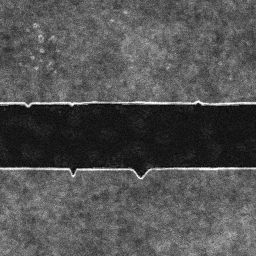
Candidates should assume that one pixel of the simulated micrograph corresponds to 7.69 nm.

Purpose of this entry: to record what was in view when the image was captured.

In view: one or a few lines or trenches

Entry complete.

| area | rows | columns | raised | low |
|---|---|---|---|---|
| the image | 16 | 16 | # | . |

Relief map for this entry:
################
################
################
################
################
################
................
................
................
................
................
################
################
################
################
################